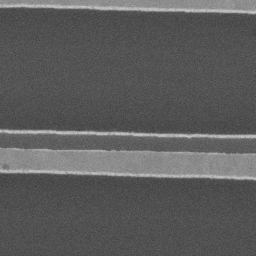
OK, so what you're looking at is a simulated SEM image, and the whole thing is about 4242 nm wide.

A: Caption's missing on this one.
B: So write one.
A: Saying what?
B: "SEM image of lines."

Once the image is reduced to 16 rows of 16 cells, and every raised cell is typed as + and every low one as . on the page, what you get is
.......+++++++++
................
................
................
................
................
................
................
+++++++++.......
++++++++++++++++
++++++++++++++++
................
................
................
................
................